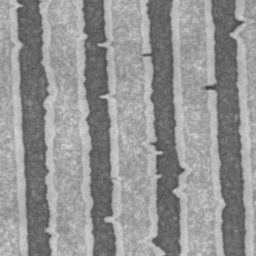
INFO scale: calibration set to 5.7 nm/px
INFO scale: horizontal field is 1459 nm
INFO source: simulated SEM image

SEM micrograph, one or a few lines or trenches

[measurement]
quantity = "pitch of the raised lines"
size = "369 nanometres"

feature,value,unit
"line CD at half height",197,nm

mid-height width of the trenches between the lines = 176 nanometres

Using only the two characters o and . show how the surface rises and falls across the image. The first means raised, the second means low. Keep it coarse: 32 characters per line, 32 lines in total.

oo....oooo....oooo....oooo....oo
oo...ooooo....oooo....oooo....oo
oo....oooo....oooo....oooo....oo
oo....oooo....oooo....oooo....oo
oo....oooo....oooo....oooo...ooo
oo....oooo....oooo....oooo....oo
oo....oooo....oooo....oooo....oo
oo....oooo....oooo....oooo....oo
oo....oooo....ooooo...oooo....oo
oo....oooo....ooooo...oooo....oo
oo....oooo....ooooo...oooo....oo
oo.....ooo....oooo....oooo....oo
oo....oooo....oooo....oooo....oo
oo....oooo....ooooo...oooo.....o
oo....ooooo...ooooo...ooooo....o
oo....oooo....ooooo....oooo....o
oo....oooo....ooooo...ooooo....o
oo....ooooo...ooooo....oooo....o
oo....ooooo...ooooo....oooo....o
oo....ooooo...ooooo....oooo....o
oo....ooooo...ooooo....oooo....o
ooo...ooooo...ooooo....oooo....o
ooo...ooooo....oooo....oooo....o
ooo...ooooo....oooo...ooooo....o
ooo....oooo....oooo....oooo....o
ooo....oooo....oooo....ooooo...o
ooo....oooo....oooo....oooo....o
ooo....oooo...ooooo....oooo....o
ooo...ooooo....oooo....oooo....o
ooo....oooo....oooo....oooo....o
ooo....oooo....oooo....oooo....o
ooo....oooo....ooooo...oooo....o